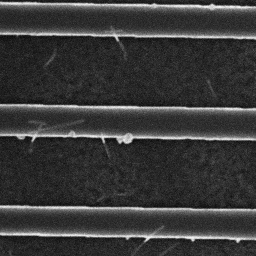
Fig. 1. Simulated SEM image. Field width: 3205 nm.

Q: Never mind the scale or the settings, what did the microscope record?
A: lines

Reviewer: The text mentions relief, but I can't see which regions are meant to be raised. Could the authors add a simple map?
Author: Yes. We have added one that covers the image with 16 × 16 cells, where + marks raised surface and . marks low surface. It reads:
++++++++++++++++
++++++++++++++++
................
................
................
................
................
++++++++++++++++
.+++++++++++++++
................
................
................
................
++++++++++++++++
++++++++++++++++
................